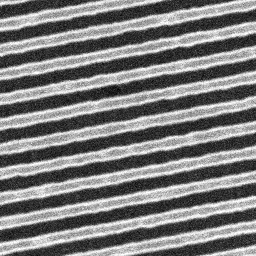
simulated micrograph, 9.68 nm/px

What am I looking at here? parallel lines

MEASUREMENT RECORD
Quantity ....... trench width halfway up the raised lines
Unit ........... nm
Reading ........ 134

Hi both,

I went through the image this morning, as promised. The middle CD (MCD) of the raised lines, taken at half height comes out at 96.4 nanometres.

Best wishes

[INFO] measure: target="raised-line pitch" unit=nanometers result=236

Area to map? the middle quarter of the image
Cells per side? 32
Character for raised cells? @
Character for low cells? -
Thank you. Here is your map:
@@@-------------------@@@@@@@@@@
-----------------@@@@@@@@@@@@@@-
-------------@@@@@@@@@@@--------
-------@@@@@@@@@@@@@------------
@@@@@@@@@@@@@@@-----------------
@@@@@@@@@--------------------@@@
@@@@--------------------@@@@@@@@
------------------@@@@@@@@@@@@@-
-------------@@@@@@@@@@@-@@-----
------@@@@@@@@@@@@@@@-----------
--@@@@@@@@@@@@@@----------------
@@@@@@@@@@---------------------@
@@@@---------------------@@@@@@@
--------------------@@@@@@@@@@@@
--------------@@@@@@@@@@@@@@@---
---------@@@@@@@@@@@@@----------
----@@@@@@@@@@@@@@--------------
@@@@@@@@@@@@-------------------@
@@@@@@@-------------------@@@@@@
@@-------------------@@@@@@@@@@@
----------------@@@@@@@@@@@@@---
----------@@@@@@@@@@@@@---------
-----@@@@@@@@@@@@@@-------------
@@@@@@@@@@@@@@------------------
@@@@@@@--------------------@@@@@
@@-------------------@@@@@@@@@@@
-----------------@@@@@@@@@@@@@--
------------@@@@@@@@@@@@@@------
-----@@@@@@@@@@@@@--------------
@@@@@@@@@@@@@@------------------
@@@@@@@@@-------------------@@@@
@@@--------------------@@@@@@@@@